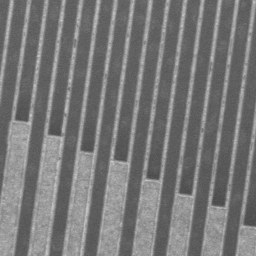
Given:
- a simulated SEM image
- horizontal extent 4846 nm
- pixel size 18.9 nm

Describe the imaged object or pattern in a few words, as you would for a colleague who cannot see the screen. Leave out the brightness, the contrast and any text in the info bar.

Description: parallel lines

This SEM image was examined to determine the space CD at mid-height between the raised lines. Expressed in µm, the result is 0.277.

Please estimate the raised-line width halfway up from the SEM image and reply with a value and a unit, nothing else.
54 nm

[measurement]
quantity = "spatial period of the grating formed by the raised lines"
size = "0.325 microns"